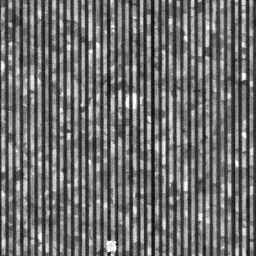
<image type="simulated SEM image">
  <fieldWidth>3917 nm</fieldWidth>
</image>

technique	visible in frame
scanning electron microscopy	parallel lines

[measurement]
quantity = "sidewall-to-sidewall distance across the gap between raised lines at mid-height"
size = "59.3 nm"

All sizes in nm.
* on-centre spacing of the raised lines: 112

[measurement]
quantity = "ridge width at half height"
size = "0.044 µm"